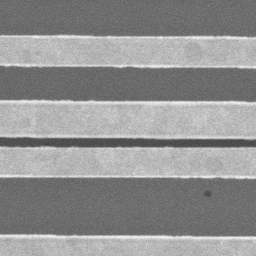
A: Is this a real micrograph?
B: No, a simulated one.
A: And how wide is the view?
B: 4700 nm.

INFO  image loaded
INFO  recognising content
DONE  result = lines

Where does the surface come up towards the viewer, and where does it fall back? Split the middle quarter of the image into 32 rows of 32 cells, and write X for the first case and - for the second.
-----------------------------XXX
--------------------------------
--------------------------------
--------------------------------
--------------------------------
--------------------------------
--------------------------------
--------------------------------
--------------------------------
--------------------------------
XXXXXXXXXXXXXXXXXXXXXXXXXXXXXXXX
XXXXXXXXXXXXXXXXXXXXXXXXXXXXXXXX
XXXXXXXXXXXXXXXXXXXXXXXXXXXXXXXX
XXXXXXXXXXXXXXXXXXXXXXXXXXXXXXXX
XXXXXXXXXXXXXXXXXXXXXXXXXXXXXXXX
XXXXXXXXXXXXXXXXXXXXXXXXXXXXXXXX
XXXXXXXXXXXXXXXXXXXXXXXXXXXXXXXX
XXXXXXXXXXXXXXXXXXXXXXXXXXXXXXXX
-------------------------XXXXXXX
--------------------------------
--------------------------------
XXXXXXXXXXXXXXXXXXXXXXXXXXXXXXXX
XXXXXXXXXXXXXXXXXXXXXXXXXXXXXXXX
XXXXXXXXXXXXXXXXXXXXXXXXXXXXXXXX
XXXXXXXXXXXXXXXXXXXXXXXXXXXXXXXX
XXXXXXXXXXXXXXXXXXXXXXXXXXXXXXXX
XXXXXXXXXXXXXXXXXXXXXXXXXXXXXXXX
XXXXXXXXXXXXXXXXXXXXXXXXXXXXXXXX
--------------------------------
--------------------------------
--------------------------------
--------------------------------